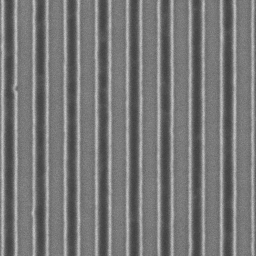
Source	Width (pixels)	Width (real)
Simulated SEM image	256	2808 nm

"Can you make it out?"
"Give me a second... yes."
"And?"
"parallel lines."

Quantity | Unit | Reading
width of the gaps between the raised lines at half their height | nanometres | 182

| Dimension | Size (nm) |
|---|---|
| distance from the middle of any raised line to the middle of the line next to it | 344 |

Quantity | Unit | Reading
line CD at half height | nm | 154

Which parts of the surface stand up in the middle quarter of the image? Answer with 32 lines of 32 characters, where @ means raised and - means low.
@@@@----@@@@----@@@-----@@@----@
@@@@----@@@-----@@@-----@@@-----
@@@@----@@@@----@@@-----@@@-----
@@@@----@@@@----@@@-----@@@----@
@@@@----@@@@----@@@-----@@@----@
@@@@----@@@@----@@@-----@@@-----
@@@@----@@@@----@@@-----@@@----@
@@@@----@@@-----@@@-----@@@----@
@@@@----@@@@----@@@-----@@@----@
@@@@----@@@@----@@@-----@@@----@
@@@@----@@@@----@@@-----@@@----@
@@@@----@@@@----@@@-----@@@----@
@@@@----@@@@----@@@-----@@@----@
@@@@----@@@@----@@@-----@@@----@
@@@@----@@@@----@@@-----@@@----@
@@@@----@@@@----@@@-----@@@----@
@@@@----@@@@----@@@-----@@@----@
@@@@----@@@@----@@@-----@@@----@
@@@@----@@@@----@@@-----@@@----@
@@@@----@@@@----@@@-----@@@-----
@@@@----@@@@----@@@-----@@@----@
@@@@----@@@@----@@@-----@@@----@
@@@@----@@@@----@@@-----@@@----@
@@@@----@@@@----@@@-----@@@----@
@@@@----@@@@----@@@-----@@@----@
@@@@----@@@@----@@@-----@@@----@
@@@@----@@@@----@@@-----@@@----@
@@@@----@@@-----@@@-----@@@----@
@@@@----@@@-----@@@-----@@@----@
@@@@----@@@-----@@@-----@@@----@
@@@@----@@@@----@@@-----@@@----@
@@@@----@@@@----@@@-----@@@----@